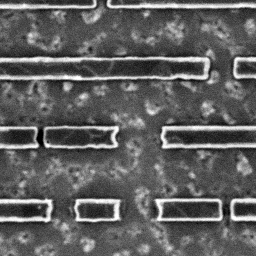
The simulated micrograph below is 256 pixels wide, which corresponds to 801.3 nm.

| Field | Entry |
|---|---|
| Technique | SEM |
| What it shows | one or a few lines or trenches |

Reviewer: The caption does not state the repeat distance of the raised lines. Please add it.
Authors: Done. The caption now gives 0.221 microns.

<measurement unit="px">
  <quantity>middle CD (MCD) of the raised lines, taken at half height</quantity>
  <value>19.9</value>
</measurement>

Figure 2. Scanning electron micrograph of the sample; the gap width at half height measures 0.159 micrometres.